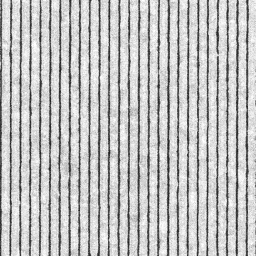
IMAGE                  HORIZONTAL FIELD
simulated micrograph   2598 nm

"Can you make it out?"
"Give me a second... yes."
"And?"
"parallel lines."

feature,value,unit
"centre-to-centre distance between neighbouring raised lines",100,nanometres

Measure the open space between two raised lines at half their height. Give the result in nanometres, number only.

26.6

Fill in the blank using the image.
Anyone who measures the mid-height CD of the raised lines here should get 73.6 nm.